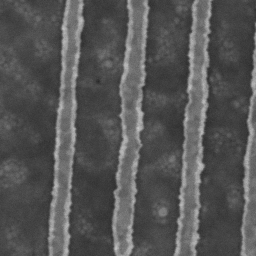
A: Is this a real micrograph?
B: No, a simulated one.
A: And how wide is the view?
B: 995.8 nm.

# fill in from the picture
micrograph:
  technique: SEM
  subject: one or a few lines or trenches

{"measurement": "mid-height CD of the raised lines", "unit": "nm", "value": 68.5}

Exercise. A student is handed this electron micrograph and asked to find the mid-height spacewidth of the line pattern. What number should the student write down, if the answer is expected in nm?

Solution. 180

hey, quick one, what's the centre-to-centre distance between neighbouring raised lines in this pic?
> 0.25 um